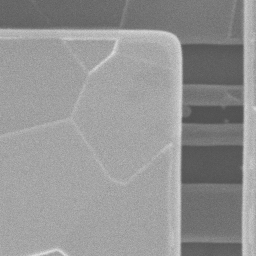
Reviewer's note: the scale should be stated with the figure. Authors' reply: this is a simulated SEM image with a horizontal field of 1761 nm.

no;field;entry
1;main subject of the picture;wiring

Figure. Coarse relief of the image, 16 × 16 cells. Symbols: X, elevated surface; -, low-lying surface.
---------------X
---------------X
XXXXXXXXXXX----X
XXXXXXXXXXX----X
XXXXXXXXXXX----X
XXXXXXXXXXX----X
XXXXXXXXXXX----X
XXXXXXXXXXX----X
XXXXXXXXXXX----X
XXXXXXXXXXX----X
XXXXXXXXXXX----X
XXXXXXXXXXX----X
XXXXXXXXXXX----X
XXXXXXXXXXX----X
XXXXXXXXXXX----X
XXXXXXXXXXX----X